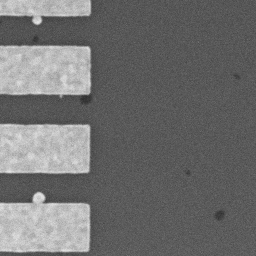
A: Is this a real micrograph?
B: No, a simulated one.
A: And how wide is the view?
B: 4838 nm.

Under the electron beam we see wiring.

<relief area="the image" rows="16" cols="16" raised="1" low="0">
1111110000000000
0000000000000000
0000000000000000
1111110000000000
1111110000000000
1111110000000000
0000000000000000
0000000000000000
1111110000000000
1111110000000000
1111100000000000
0000000000000000
0010000000000000
1111110000000000
1111110000000000
1111100000000000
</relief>